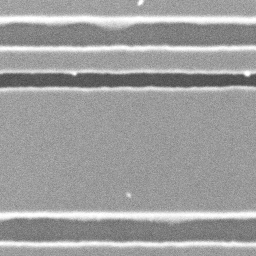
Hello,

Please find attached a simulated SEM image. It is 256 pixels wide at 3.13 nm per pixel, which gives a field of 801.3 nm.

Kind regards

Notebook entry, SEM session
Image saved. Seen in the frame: lines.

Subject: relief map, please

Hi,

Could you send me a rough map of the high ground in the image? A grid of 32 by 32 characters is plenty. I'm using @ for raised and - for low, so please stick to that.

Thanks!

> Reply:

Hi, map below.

@@@@@@@@@@@@@@@@@@@@@@@@@@@@@@@@
@@@@@@@@@@@@@@@@@@@@@@@@@@@@@@@@
@@---@@@@--@@@@@@@@@---@@@@@@@@@
--------------------------------
--------------------------------
--------------------------------
@@@@@@@@@@@@@@@@@@@@@@@@@@@@@@@@
@@@@@@@@@@@@@@@@@@@@@@@@@@@@@@@@
@@@@@@@@@@@@@@@@@@@@@@@@@@@@@@@@
--------------------------------
--------------------------------
@@@@@@@@@@@@@@@@@@@@@@@@@@@@@@@@
@@@@@@@@@@@@@@@@@@@@@@@@@@@@@@@@
@@@@@@@@@@@@@@@@@@@@@@@@@@@@@@@@
@@@@@@@@@@@@@@@@@@@@@@@@@@@@@@@@
@@@@@@@@@@@@@@@@@@@@@@@@@@@@@@@@
@@@@@@@@@@@@@@@@@@@@@@@@@@@@@@@@
@@@@@@@@@@@@@@@@@@@@@@@@@@@@@@@@
@@@@@@@@@@@@@@@@@@@@@@@@@@@@@@@@
@@@@@@@@@@@@@@@@@@@@@@@@@@@@@@@@
@@@@@@@@@@@@@@@@@@@@@@@@@@@@@@@@
@@@@@@@@@@@@@@@@@@@@@@@@@@@@@@@@
@@@@@@@@@@@@@@@@@@@@@@@@@@@@@@@@
@@@@@@@@@@@@@@@@@@@@@@@@@@@@@@@@
@@@@@@@@@@@@@@@@@@@@@@@@@@@@@@@@
@@@@@@@@@@@@@@@@@@@@@@@@@@@@@@@@
@@@@@@@@@@@@@@@@@@@@@@@@@@@@@@@@
--------------------------------
--------------------------------
--------------------------------
@@@@@@@@@@@@@@@@@@@-@@@@@@@@@@--
@@@@@@@@@@@@@@@@@@@@@@@@@@@@@@@@